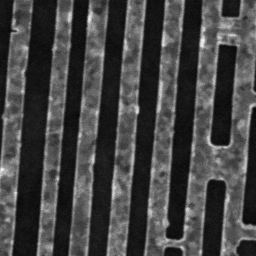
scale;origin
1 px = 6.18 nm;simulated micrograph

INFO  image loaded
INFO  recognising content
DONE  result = parallel lines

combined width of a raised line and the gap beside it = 232 nm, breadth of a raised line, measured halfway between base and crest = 109 nanometres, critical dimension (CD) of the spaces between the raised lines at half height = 0.12 micrometres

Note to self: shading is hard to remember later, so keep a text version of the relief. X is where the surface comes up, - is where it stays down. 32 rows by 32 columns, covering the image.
--XX---XX--XX---XX---XX--XXX--XX
--XX---XX--XX---XX---XX--XXX--XX
--XX---XX--XX---XX---XX--XXXXXXX
--XX---XX--XX---XX---XX--XXXXXXX
-XXX---XX--XX---XX--XXX--XXXXXXX
-XXX---XX--XX--XXX--XXX--XXXXXXX
-XX----XX--XX--XXX--XX---XX---XX
-XX----X---XX--XX---XX---XX---XX
-XX----X---XX--XX---XX---XX---XX
-XX---XX---XX--XX---XX---XX--XXX
-XX---XX--XXX--XX---XX---XX--XXX
-XX---XX--XXX--XX---XX---XX--XXX
-XX---XX--XX---XX---XX---XX--XXX
-XX---XX--XX---XX---XX--XXX--XXX
XXX---XX--XX---XX---XX--XX---XX-
XXX---XX--XX---XX---XX--XX---XX-
XXX---XX--XX---XX--XXX--XX---XX-
XXX---XX--XX---XX--XX---XX---XX-
XXX---XX--XX---XX--XX---XXXXXXX-
XX----X---XX--XXX--XX---XXXXXXX-
XX---XX---XX--XXX--XX---XXXXXXX-
XX----X---XX--XXX--XX---XXXXXXX-
XX---XX--XXX--XX---XX---XX--XXX-
XX---XX--XX---XX---XX---XX--XX--
XX---XX--XXX--XX---XX--XXX--XX--
XX---XX--XX---XX---XX--XXX--XX--
XX---XX--XX---XX---XX--XX---XX--
XX---XX--XX---XX---XX--XX---XX--
XX---XX--XX---XX--XXX--XX---XXXX
XX---XX--XX---XX--XXX--XX---XXXX
XX---XX--XX---XX--XXXXXXX---XX--
XX---X---XX--XXX--XX---XX---XX--